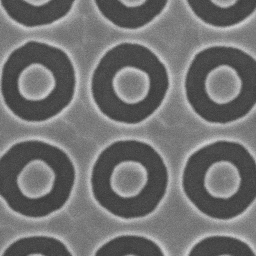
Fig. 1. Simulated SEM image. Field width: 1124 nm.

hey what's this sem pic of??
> ring-shaped grooves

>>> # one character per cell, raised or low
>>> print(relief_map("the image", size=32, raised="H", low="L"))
LLLLHLLLLHHHLLLLHHLLLHHLLLLHHLLL
HLLLLLLLLHHHHLLLLLLLHHHHLLLLLLLL
HHLLLLLHHHHHHLLLLLLHHHHHHLLLLLLH
HHHHHHHHHHHHHHHLLHHHHHHHHHHHHHHH
HHHHHHHHHHHHHHHHHHHHHHHHHHHHHHHH
HHHLLLHHHHHHHHHLLHHHHHHHHHHHHHHH
HHLLLLLLHHHHHLLLLLLHHHHHHLLLLLLH
HLLLLLLLLHHHLLLLLLLLHHHHLLLLLLLL
LLLHHHLLLHHHLLLLLLLLLHHHLLLHHLLL
LLLHHHHLLLHLLLHHHHLLLHHLLLHHHHLL
LLHHHHHLLHHLLLHHHHHLLHHLLLHHHHLL
LLLHHHLLLHHLLLHHHHLLLHHLLLHHHHLL
LLLLLLLLLHHHLLLHHHLLHHHLLLLHHLLL
HLLLLLLLHHHHLLLLLLLLHHHHLLLLLLLL
HHLLLLLHHHHHHLLLLLLHHHHHHLLLLLLH
HHHHHHHHHHHHHHHHLHHHHHHHHHHHHHHH
HHHHHHHHHHHHHHHHHHHHHHHHHHHHHHHH
HHHHLHHHHHHHHHHHLHHHHHHHHHHHHHHH
HLLLLLLHHHHHHLLLLLLHHHHHHLLLLLLH
LLLLLLLLLHHHLLLLLLLLHHHHLLLLLLLL
LLLLHHLLLHHHLLLHHLLLLHHLLLLHHLLL
LLLHHHHLLHHLLLHHHHLLLHHLLLHHHHLL
LLHHHHHLLHHLLLHHHHLLLHHLLLHHHHLL
LLHHHHLLLHHLLLHHHHLLLHHLLLHHHHLL
LLLHHLLLLHHHLLLHHLLLLHHLLLLHHLLL
HLLLLLLLHHHHLLLLLLLLHHHHLLLLLLLH
HHLLLLLHHHHHHHLLLLLHHHHHHLLLLLHH
HHHHHHHHHHHHHHHHHHHHHHHHHHHHHHHH
HHHHHHHHHHHHHHHHHHHHHHHHHHHHHHHH
HHHHLLHHHHHHHHHLLLHHHHHHHHLLHHHH
HLLLLLLLHHHHHLLLLLLLHHHHLLLLLLLH
LLLLLLLLLHHHLLLLLLLLHHHHLLLLLLLL